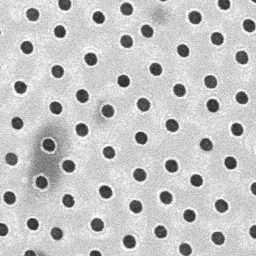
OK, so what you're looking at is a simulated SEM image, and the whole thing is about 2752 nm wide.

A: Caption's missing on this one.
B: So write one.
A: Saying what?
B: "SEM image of a regular array of holes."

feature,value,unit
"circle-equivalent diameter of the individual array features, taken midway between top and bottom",0.141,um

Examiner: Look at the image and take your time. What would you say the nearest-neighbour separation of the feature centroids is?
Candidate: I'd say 338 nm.